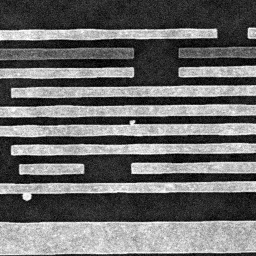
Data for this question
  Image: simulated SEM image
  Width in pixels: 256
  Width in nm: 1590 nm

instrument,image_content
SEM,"wiring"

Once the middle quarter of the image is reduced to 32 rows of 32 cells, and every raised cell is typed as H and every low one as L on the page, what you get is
LLLLLLLLLLLLLLLLLLLLLLLLLLLLLLLL
HHHHHHHHHHHHHHHHHLLLLLLLLLLLLHHH
HHHHHHHHHHHHHHHHHLLLLLLLLLLLLHHH
LLLLLLLLLLLLLLLLLLLLLLLLLLLLLLLL
LLLLLLLLLLLLLLLLLLLLLLLLLLLLLLLL
LLLLLLLLLLLLLLLLLLLLLLLLLLLLLLLL
HHHHHHHHHHHHHHHHHHHHHHHHHHHHHHHH
HHHHHHHHHHHHHHHHHHHHHHHHHHHHHHHH
LLLLLLLLLLLLLLLLLLLLLLLLLLLLLLLL
LLLLLLLLLLLLLLLLLLLLLLLLLLLLLLLL
HHHLLLLLLLLLLLLHHHHHHHHHHHHHHHHH
HHHHHHHHHHHHHHHHHHHHHHHHHHHHHHHH
HHHHHHHHHHHHHHHHHHHHHHHHHHHHHHHH
LLLLLLLLLLLLLLLLLLLLLLLLLLLLLLLL
LLLLLLLLLLLLLLLLLLLLLLLLLLLLLLLL
HHHHHHHHHHHHHHHHHHHHHHHHHHHHHHHH
HHHHHHHHHHHHHHHHHHHHHHHHHHHHHHHH
HHHHHHHHHHHHHHHHHHHHHHHHHHHHHHHL
LLLLLLLLLLLLLLLLLLLLLLLLLLLLLLLL
LLLLLLLLLLLLLLLLLLLLLLLLLLLLLLLL
HHHHHHHHHHHHHHHHHHHHHHHHHHHHHHHH
HHHHHHHHHHHHHHHHHHHHHHHHHHHHHHHH
HHHHHHLLLLLLLLLLLLLLLLLLLLLLLLLL
LLLLLLLLLLLLLLLLLLLLLLLLLLLLLLLL
LLLLLLLLLLLLLLLLLLLLLLLLLLLLLLLL
HHHHHLLLLLLLLLLLLHHHHHHHHHHHHHHH
HHHHHLLLLLLLLLLLLHHHHHHHHHHHHHHH
LLLLLLLLLLLLLLLLLLLLLLLLLLLLLLLL
LLLLLLLLLLLLLLLLLLLLLLLLLLLLLLLL
LLLLLLLLLLLLLLLLLLLLLLLLLLLLLLLL
HHHHHHHHHHHHHHHHHHHHHHHHHHHHHHHH
HHHHHHHHHHHHHHHHHHHHHHHHHHHHHHHH